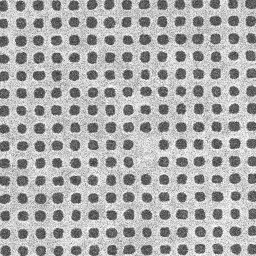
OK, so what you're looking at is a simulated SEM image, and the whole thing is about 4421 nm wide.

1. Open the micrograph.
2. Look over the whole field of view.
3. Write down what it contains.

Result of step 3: a regular array of holes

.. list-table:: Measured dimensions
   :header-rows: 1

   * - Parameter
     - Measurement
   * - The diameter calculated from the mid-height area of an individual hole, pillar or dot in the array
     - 205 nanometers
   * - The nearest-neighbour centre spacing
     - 0.296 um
